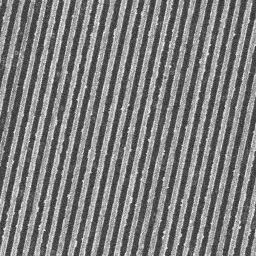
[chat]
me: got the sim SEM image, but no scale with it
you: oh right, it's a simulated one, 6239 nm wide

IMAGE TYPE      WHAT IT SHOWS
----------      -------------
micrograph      parallel lines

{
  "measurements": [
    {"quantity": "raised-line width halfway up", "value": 185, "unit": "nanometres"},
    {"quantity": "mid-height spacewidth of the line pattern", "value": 0.0924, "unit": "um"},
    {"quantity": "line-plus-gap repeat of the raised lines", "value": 272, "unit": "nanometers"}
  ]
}